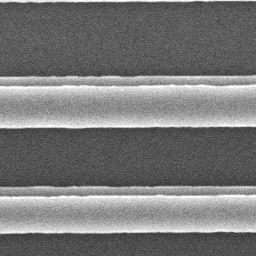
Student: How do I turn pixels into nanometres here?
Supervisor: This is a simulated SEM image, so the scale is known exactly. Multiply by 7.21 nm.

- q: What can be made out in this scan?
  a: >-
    lines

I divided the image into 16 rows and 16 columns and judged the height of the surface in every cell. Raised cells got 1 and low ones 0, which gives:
0000000000000000
0000000000000000
0000000000000000
0000000000000000
0000000000000000
1111111111111111
1111111111111111
1111111111111111
0000000000000000
0000000000000000
0000000000000000
0000000000000000
1111111111111111
1111111111111111
1110011000000000
0000000000000000